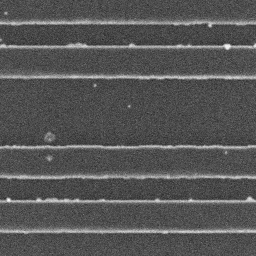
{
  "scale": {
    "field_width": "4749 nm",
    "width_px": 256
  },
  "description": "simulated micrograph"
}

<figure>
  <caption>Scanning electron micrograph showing lines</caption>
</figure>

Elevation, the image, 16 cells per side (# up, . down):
################
#...............
................
################
################
................
................
................
................
################
################
................
................
################
####.###########
................